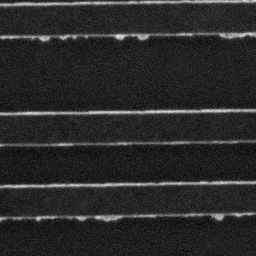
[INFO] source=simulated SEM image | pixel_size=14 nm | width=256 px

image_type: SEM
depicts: lines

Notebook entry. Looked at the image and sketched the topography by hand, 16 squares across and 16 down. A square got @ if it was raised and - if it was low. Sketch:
@@@@@@@@@@@@@@@@
@@@@@@@@@@@@@@@@
----------------
----------------
----------------
----------------
----------------
@@@@@@@@@@@@@@@@
@@@@@@@@@@@@@@@@
----------------
----------------
----------@@@@@@
@@@@@@@@@@@@@@@@
@@@@@@@@@@------
----------------
----------------